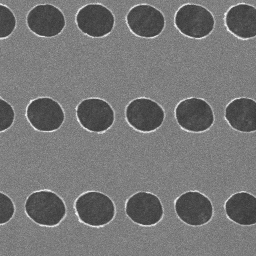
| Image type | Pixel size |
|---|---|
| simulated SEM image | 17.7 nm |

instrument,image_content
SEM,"a regular array of holes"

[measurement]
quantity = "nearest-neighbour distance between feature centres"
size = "873 nm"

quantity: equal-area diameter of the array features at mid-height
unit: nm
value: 621